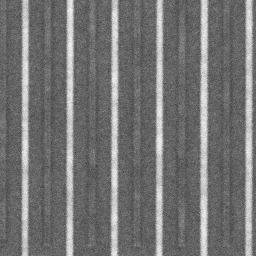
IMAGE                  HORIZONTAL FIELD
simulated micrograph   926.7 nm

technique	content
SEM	parallel lines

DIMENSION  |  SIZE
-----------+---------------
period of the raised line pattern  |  81.1 nm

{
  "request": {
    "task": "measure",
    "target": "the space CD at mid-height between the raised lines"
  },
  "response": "61.6 nanometres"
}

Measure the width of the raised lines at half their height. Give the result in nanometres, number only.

19.5